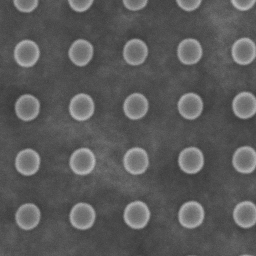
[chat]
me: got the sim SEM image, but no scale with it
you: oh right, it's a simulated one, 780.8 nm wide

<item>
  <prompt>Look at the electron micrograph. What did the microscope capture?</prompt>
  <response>a regular array of raised bodies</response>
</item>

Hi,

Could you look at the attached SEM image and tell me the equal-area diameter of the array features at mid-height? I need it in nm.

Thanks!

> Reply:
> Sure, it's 73.6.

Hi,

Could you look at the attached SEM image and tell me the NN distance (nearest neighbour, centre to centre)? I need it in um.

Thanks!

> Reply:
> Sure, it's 0.165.